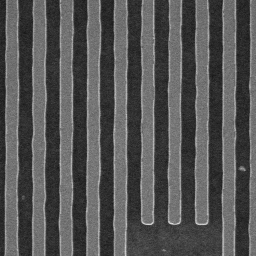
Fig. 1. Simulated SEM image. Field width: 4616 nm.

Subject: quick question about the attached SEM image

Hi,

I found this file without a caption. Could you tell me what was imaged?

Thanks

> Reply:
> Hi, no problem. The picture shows groups of lines, slits or small figures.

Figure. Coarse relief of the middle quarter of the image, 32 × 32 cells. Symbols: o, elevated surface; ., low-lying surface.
oo....ooo....ooo...ooo....ooo...
oo....ooo....ooo....oo....ooo...
oo....ooo....ooo....oo....ooo...
oo....ooo....ooo....oo....ooo...
oo....ooo....ooo...ooo....ooo...
oo....ooo....ooo...ooo....ooo...
oo....ooo....ooo...ooo....ooo...
oo....ooo....ooo...ooo....ooo...
oo....ooo....ooo...ooo....ooo...
oo....ooo....ooo...ooo....ooo...
oo....ooo....ooo...ooo....ooo...
oo....ooo....ooo...ooo....ooo...
oo....ooo....ooo...ooo....ooo...
oo....ooo....ooo...ooo....ooo...
oo....ooo....ooo...ooo....ooo...
oo....ooo....ooo...ooo....ooo...
oo....ooo....ooo...ooo....ooo...
oo....ooo....ooo...ooo....ooo...
oo....ooo....ooo...ooo....ooo...
oo....ooo....ooo...ooo....ooo...
oo....ooo....ooo...ooo....ooo...
oo....ooo....ooo...ooo....ooo...
oo....ooo....ooo...ooo....ooo...
oo....ooo....ooo...ooo....ooo...
oo....ooo....ooo...ooo....ooo...
oo....ooo....ooo...ooo....ooo...
oo....ooo....ooo...ooo....ooo...
oo....ooo....ooo...ooo....ooo...
oo....ooo....ooo...ooo....ooo...
oo....ooo....ooo...ooo....ooo...
oo....ooo....ooo...ooo....ooo...
oo....oo.....ooo...ooo....ooo...